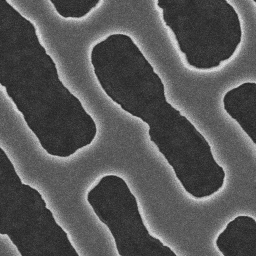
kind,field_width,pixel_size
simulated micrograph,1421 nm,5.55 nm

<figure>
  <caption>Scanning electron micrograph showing holes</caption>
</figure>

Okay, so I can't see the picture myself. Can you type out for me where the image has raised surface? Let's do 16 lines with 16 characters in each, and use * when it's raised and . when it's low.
.**...****.....*
..********.....*
..****..***....*
...***...**...**
....**....******
....**....*****.
*....**....***..
**....***...***.
**....***....***
***..*****...***
.**********...**
..****..***...**
...***..********
...***...*******
....***..*****..
*....**....***..